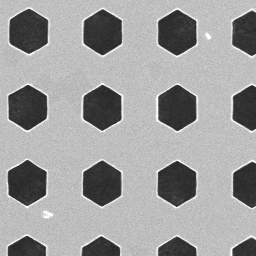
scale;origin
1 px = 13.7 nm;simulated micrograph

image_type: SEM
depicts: a regular array of holes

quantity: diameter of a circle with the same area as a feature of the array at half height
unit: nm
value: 572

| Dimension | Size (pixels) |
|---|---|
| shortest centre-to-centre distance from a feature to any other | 74.7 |